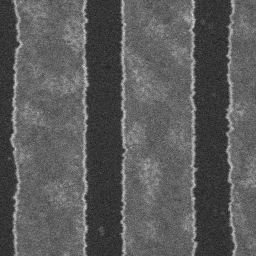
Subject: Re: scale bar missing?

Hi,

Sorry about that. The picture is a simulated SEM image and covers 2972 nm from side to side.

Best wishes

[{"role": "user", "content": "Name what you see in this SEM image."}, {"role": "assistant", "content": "one or a few lines or trenches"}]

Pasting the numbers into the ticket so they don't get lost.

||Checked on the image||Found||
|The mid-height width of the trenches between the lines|438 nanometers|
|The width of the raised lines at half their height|0.812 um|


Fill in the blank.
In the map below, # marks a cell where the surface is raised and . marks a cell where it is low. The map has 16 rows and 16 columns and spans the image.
.####...####...#
.####...####..##
.####...####..##
.####...####..##
.####...####..##
.####...####..##
.####...####..##
.####...####..##
.####...####..##
.####...####..##
.####...####..##
.####...####..##
.####...####..##
.####...####..##
.####...####...#
.####...####...#